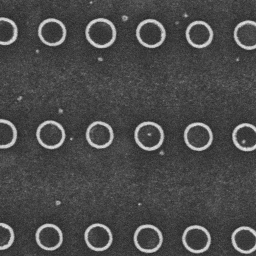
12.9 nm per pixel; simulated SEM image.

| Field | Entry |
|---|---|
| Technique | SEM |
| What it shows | a regular array of raised bodies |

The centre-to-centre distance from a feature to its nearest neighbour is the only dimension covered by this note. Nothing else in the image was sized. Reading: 0.626 um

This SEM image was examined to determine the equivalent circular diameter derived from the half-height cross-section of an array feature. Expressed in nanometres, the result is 332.